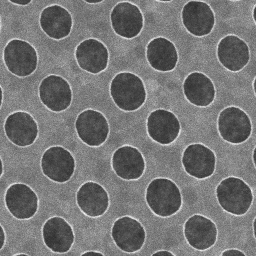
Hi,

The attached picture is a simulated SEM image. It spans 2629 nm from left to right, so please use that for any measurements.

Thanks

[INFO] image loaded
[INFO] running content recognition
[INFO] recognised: a regular array of holes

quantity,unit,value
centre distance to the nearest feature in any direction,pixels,49.5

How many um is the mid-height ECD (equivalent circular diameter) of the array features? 0.351